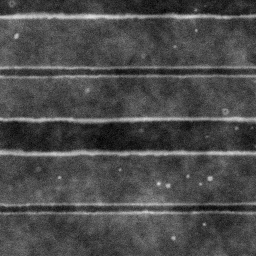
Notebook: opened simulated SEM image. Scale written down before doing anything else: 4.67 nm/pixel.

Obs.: lines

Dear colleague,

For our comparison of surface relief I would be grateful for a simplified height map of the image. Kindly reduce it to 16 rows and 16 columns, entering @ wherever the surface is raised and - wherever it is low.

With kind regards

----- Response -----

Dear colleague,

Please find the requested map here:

----------------
@@@@@@@@@@@@@@@@
@@@@@@@@@@@@@@@@
@@@@@@@@@@@@@@@@
@@@@@@@@@@@@@@@@
@@@@@@@@@@@@@@@@
@@@@@@@@@@@@@@@@
-----@@---------
----------------
----------------
@@@@@@@@@@@@@@@@
@@@@@@@@@@@@@@@@
@@@@@@@@@@@@@@@@
@@@@@@@@@@@@@@@@
@@@@@@@@@@@@@@@@
@@@@@@@@@@@@@@@@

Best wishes